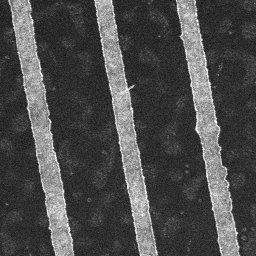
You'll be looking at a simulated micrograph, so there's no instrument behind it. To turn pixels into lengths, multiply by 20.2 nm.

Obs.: one or a few lines or trenches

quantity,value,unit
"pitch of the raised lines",1650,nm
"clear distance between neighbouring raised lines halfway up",1.3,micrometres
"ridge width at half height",0.35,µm